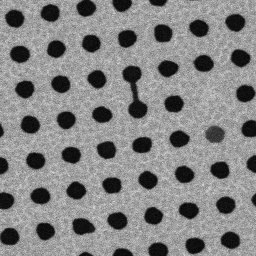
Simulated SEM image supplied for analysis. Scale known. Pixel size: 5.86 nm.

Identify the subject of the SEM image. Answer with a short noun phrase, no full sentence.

a regular array of holes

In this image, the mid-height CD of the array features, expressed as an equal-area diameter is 0.105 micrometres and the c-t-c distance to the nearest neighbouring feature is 0.209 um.